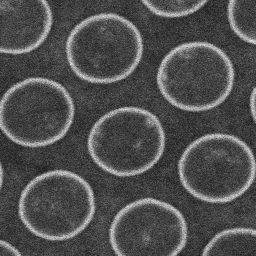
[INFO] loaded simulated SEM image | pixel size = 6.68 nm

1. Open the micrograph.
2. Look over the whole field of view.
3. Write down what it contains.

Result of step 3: raised bodies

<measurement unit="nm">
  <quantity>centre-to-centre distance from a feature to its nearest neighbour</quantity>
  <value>630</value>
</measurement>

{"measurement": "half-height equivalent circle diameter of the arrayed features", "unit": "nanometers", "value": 467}